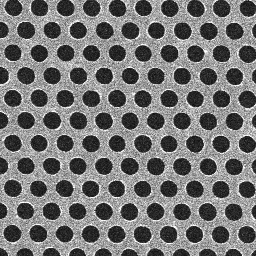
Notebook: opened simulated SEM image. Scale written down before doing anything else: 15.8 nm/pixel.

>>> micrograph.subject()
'a regular array of holes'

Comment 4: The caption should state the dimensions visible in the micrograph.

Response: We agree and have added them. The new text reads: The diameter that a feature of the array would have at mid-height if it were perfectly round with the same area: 277 nm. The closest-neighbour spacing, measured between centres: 409 nanometres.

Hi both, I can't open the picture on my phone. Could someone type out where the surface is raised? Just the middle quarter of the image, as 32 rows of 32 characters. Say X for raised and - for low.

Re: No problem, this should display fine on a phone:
XXXXXXXXXXXXXXXXXXXXXXXXXXXXXXXX
XX---XXX----XXX---XXXX--XXXX---X
X-----XX----XXX----XX----XXX----
XX----XX----XXX----XX----XXX----
XX---XXXX---XXX---XXX----XXX---X
XXXXXXXXXXXXXXXXXXXXXXXXXXXXXXXX
-XXXXX-XXXXXXXXXXXXXXXXXXXXXXXXX
--XXX----XX----XXX----XXX---XXX-
--XX-----XX----XX-----XX----XX--
--XXX----XX----XXX----XX----XXX-
--XXXX--XXXX---XXXX--XXXX---XXXX
XXXXXXXXXXXXXXXXXXXXXXXXXXXXXXXX
XX---XXXX--XXXX---XXXX--XXXX---X
X-----XX----XX-----XX----XX-----
X-----XX----XX-----XX----XX-----
XX----XX----XXX---XXX----XXX---X
XXX-XXXXXXXXXXXXXXXXXXXXXXXXXXXX
XXXXXXXXXXXXXXXXXXXXXXXXXXXXXXXX
--XXX---XXXX---XXX----XXX---XXX-
--XXX----XX----XX-----XX----XX--
--XXX----XX----XXX----XX----XXX-
--XXX----XXX---XXX---XXXX---XXX-
XXXXXXXXXXXXXXXXXXXXXXXXXXXXXXXX
XXX-XXXXX--XXXXX-XXXXX--XXXXX-XX
X----XXX----XX----XXX----XX----X
X-----XX----XX-----XX----XX-----
X-----XX----XX-----XX----XX-----
XXX-XXXXX--XXXX---XXXX--XXXX---X
XXXXXXXXXXXXXXXXXXXXXXXXXXXXXXXX
--XXX---XXXX--XXXXX--XXXX--XXXX-
--XXX----XX----XXX----XX----XXX-
--XX-----XX----XXX----XX-----XX-